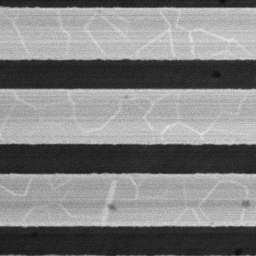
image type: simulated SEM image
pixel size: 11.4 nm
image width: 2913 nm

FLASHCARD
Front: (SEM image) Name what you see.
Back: lines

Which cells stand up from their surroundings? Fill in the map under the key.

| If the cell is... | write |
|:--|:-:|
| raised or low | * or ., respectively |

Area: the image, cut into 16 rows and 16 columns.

*...............
****************
****************
****************
................
................
****************
****************
****************
................
................
****************
****************
****************
................
................